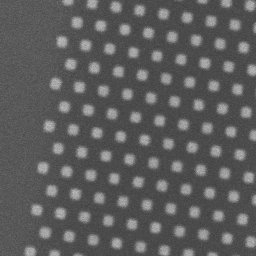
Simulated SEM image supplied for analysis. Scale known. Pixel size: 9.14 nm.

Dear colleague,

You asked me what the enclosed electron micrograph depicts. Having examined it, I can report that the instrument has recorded a regular array of raised bodies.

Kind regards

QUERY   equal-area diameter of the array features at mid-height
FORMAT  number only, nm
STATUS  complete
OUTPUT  90.5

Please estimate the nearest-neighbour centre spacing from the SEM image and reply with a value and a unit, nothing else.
0.218 micrometres